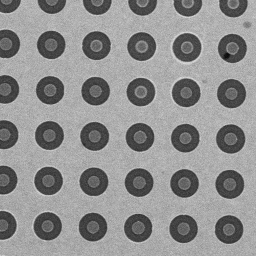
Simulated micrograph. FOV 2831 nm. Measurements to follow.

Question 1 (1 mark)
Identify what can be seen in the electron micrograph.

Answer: an array of small figures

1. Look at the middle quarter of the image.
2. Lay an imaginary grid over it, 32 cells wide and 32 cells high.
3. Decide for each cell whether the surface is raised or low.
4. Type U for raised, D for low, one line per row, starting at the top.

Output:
UUUUUUUUUUUUUUUUUUUUUUUUUUUUUUUU
UUUUUUUUUUUUUUUUUUUUUUUUUUUUUUUU
UUUUUUUUUUUUUUUUUUUUUUUUUUUUUUUU
UUUUUUDDDUUUUUUUUUDDDUUUUUUUUUDD
UUUUUDDDDDDUUUUUUDDDDDUUUUUUDDDD
UUUUDDDUDDDUUUUUDDDDDDDUUUUDDDDD
UUUUDDDUUDDDUUUUDDUUDDDUUUUDDUUU
UUUUDDDUUDDUUUUUDDUUDDDUUUUDDUUU
UUUUUDDDDDDUUUUUDDDDDDDUUUUDDDDD
UUUUUDDDDDUUUUUUUDDDDDUUUUUUDDDD
UUUUUUUDUUUUUUUUUUDDUUUUUUUUUDDD
UUUUUUUUUUUUUUUUUUUUUUUUUUUUUUUU
UUUUUUUUUUUUUUUUUUUUUUUUUUUUUUUU
UUUUUUUUUUUUUUUUUUUUUUUUUUUUUUUU
UUUUUUUDUUUUUUUUUUUUUUUUUUUUUUUU
UUUUUDDDDDUUUUUUUDDDDUUUUUUUDDDD
UUUUDDDDDDDUUUUUDDDDDDUUUUUDDDDD
UUUUDDUUUDDUUUUDDDUUDDDUUUUDDDUD
UUUUDDUUUDDUUUUDDDUUDDDUUUUDDUUU
UUUUDDDDDDDUUUUUDDUUDDDUUUUDDUUD
UUUUUDDDDDUUUUUUDDDDDDUUUUUDDDDD
UUUUUUDDDUUUUUUUUDDDDUUUUUUUDDDD
UUUUUUUUUUUUUUUUUUUUUUUUUUUUUUUU
UUUUUUUUUUUUUUUUUUUUUUUUUUUUUUUU
UUUUUUUUUUUUUUUUUUUUUUUUUUUUUUUU
UUUUUUUUUUUUUUUUUUUUUUUUUUUUUUUU
UUUUUDDDDDUUUUUUUDDDDUUUUUUUUDDU
UUUUDDDDDDDUUUUUDDDDDDUUUUUDDDDD
UUUUDDDUDDDUUUUDDDUUDDUUUUUDDDDD
UUUUDDUUUDDUUUUDDUUUDDUUUUUDDUUD
UUUUDDDUDDDUUUUDDDUUDDUUUUDDDUUD
UUUUDDDDDDDUUUUUDDDDDDUUUUUDDDDD